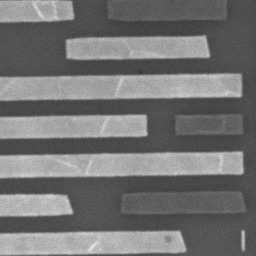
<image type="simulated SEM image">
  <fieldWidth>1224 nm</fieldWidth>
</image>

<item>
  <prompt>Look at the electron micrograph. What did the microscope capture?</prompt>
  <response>wiring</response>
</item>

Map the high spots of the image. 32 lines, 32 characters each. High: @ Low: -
@@@@@@@@@-----@@@@@@@@@@@@@@----
@@@@@@@@@-----@@@@@@@@@@@@@@----
@@@@@@@@-------@@@@@------------
--------------------------------
--------------------------------
--------@@@@@@@@@@@@@@@@@@------
--------@@@@@@@@@@@@@@@@@@------
--------------------------------
--------------------------------
--------------@@@@@@@@@@@@@@@@--
@@@@@@@@@@@@@@@@@@@@@@@@@@@@@@--
@@@@@@@@@@@@@@@@@@@@@@@@@@@@@@--
--------------------------------
--------------------------------
---------------@@@------@@@@@@--
@@@@@@@@@@@@@@@@@@----@@@@@@@@--
@@@@@@@@@@@@@@@@@@----@@@@@@@@--
--------------------------------
--------------------------------
-----@@@@@@@@@@@@@@@@@@@@@@@@@--
@@@@@@@@@@@@@@@@@@@@@@@@@@@@@@--
@@@@@@@@@@@@@@@@@@@@@@@@@@@@@@--
--------------------------------
--------------------------------
@@@@@@@@--------@@@@@@@@@@@@@@--
@@@@@@@@@------@@@@@@@@@@@@@@@--
@@@@@@@@@------@@@@@@@@@@@@@----
--------------------------------
--------------------------------
@@@@@@@@@@@@@@@@@@@@@@@---------
@@@@@@@@@@@@@@@@@@@@@@@---------
@@@@@@@@@@@@@@@@@@@@@@@---------